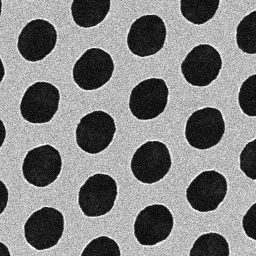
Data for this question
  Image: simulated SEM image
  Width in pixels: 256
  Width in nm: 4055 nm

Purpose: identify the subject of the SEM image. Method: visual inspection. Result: a regular array of holes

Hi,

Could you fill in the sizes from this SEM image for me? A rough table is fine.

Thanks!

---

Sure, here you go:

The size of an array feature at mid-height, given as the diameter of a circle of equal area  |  650 nm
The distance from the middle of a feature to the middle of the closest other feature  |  0.992 micrometres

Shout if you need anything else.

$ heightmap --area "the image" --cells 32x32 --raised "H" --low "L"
HHHHHHHHHLLLLLHHHHHHHHLLLLLHHHHH
HHHHHHHHHLLLLLHHHHHHHHHLLLLHHHHL
HHHHLLHHHLLLLHHHHLLLHHHLLLHHHHLL
HHHLLLLHHHHHHHHHLLLLLHHHHHHHHHLL
HHLLLLLHHHHHHHHHLLLLLHHHHHHHHLLL
HHLLLLLHHHHHHHHHLLLLLHHHHHHHHHLL
HHLLLLHHHHHLLHHHLLLLHHHHLLLHHHHL
HHHLLHHHHHLLLLHHHHHHHHHLLLLLHHHH
LHHHHHHHHLLLLLHHHHHHHHHLLLLLHHHH
HHHHHHHHHLLLLLHHHHHHHHHLLLLHHHHL
HHHHLLHHHHLLLHHHHLLLLHHHLLHHHHLL
HHHLLLLHHHHHHHHHLLLLLHHHHHHHHHLL
HHHLLLLHHHHHHHHHLLLLLHHHHHHHHHLL
HHHLLLLHHHHHHHHHLLLLLHHHHHLHHHLL
HHHLLLLHHHHLLLHHHLLLHHHHLLLLHHHL
HHHHHHHHHHLLLLHHHHHHHHHLLLLLHHHH
LHHHHHHHHLLLLLHHHHHHHHHLLLLLHHHH
LHHHHHHHHHLLLLHHHHHHHHHLLLLLHHHH
HHHHLLLHHHLLLHHHHLLLLHHHLLHHHHLL
HHHLLLLLHHHHHHHHHLLLLHHHHHHHHHLL
HHHLLLLLHHHHHHHHLLLLLHHHHHHHHHLL
HHHLLLLLHHHHHHHHLLLLLHHHHLLHHHLL
HHHLLLLHHHHLLLHHHLLLHHHHLLLLHHHH
LHHHHHHHHHLLLLLHHHHHHHHLLLLLHHHH
LHHHHHHHHHLLLLLHHHHHHHHLLLLLHHHH
LHHHHHHHHHLLLLHHHHHHHHHHLLLHHHHH
HHHHLLLHHHLLLLHHHLLLLHHHHLHHHHHL
HHHLLLLLHHHHHHHHHLLLLLHHHHHHHHLL
HHHLLLLLHHHHHHHHHLLLLLHHHHHHHHLL
HHHLLLLLHHHHHHHHHLLLLHHHHLLLHHHL
HHHHLLLHHHHLLLLHHHLHHHHHLLLLLHHH
LHHHHHHHHHLLLLLHHHHHHHHHLLLLLHHH